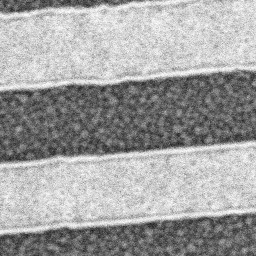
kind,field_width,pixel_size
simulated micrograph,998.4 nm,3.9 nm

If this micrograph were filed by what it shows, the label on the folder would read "one or a few lines or trenches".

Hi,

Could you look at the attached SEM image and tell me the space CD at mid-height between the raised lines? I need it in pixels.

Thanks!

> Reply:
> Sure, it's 76.7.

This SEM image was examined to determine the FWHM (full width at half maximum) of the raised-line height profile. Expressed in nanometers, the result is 259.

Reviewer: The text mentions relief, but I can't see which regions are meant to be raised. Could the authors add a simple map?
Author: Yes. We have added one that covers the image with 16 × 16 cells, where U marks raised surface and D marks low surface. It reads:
DDDDDDDUUUUUUUUU
UUUUUUUUUUUUUUUU
UUUUUUUUUUUUUUUU
UUUUUUUUUUUUUUUU
UUUUUUUUUUUUDDDD
DDDDDDDDDDDDDDDD
DDDDDDDDDDDDDDDD
DDDDDDDDDDDDDDDD
DDDDDDDDDDDDDDDD
DDDDDDDDDDUUUUUU
UUUUUUUUUUUUUUUU
UUUUUUUUUUUUUUUU
UUUUUUUUUUUUUUUU
UUUUUUUUUUUDDDDD
DDDDDDDDDDDDDDDD
DDDDDDDDDDDDDDDD